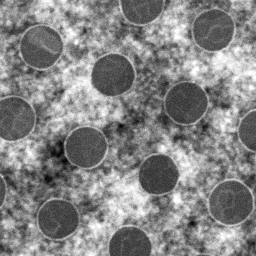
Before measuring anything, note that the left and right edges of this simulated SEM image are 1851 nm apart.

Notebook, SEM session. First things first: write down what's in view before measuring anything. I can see a regular array of raised bodies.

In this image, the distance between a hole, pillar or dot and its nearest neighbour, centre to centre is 556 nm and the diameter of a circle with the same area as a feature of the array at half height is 319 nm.